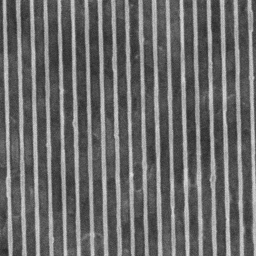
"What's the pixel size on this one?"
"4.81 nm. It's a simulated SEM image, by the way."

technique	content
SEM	parallel lines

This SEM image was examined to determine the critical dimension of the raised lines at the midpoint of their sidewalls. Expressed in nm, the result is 15.6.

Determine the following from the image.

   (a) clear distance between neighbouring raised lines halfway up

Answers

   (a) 51.1 nanometers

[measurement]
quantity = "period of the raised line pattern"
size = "0.0654 microns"